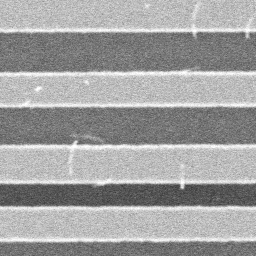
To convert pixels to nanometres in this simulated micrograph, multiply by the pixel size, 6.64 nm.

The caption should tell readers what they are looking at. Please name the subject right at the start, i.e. lines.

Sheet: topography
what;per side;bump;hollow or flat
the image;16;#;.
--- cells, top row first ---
################
################
................
................
...........#....
################
################
................
................
################
################
......#....#....
................
################
################
................